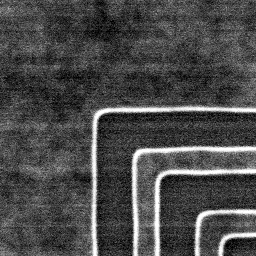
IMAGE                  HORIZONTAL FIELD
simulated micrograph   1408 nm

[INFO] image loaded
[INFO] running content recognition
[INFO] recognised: groups of lines, slits or small figures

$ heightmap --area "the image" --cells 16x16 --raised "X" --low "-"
XXXXXXXXXXXXXXXX
XXXXXXXXXXXXXXXX
XXXXXXXXXXXXXXXX
XXXXXXXXXXXXXXXX
XXXXXXXXXXXXXXXX
XXXXXXXXXXXXXXXX
XXXXXXXXXXXXXXXX
XXXXXX----------
XXXXXX----------
XXXXXX---XXXXXXX
XXXXXX--XXXXXXXX
XXXXXX--XX------
XXXXXX--XX------
XXXXXX--XX---XXX
XXXXXX--XX--XXXX
XXXXXX--XX--XX--